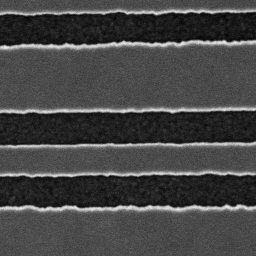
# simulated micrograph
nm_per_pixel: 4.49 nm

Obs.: lines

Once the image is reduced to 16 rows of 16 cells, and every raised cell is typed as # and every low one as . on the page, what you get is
################
................
................
################
################
################
################
................
................
################
################
................
................
################
################
################